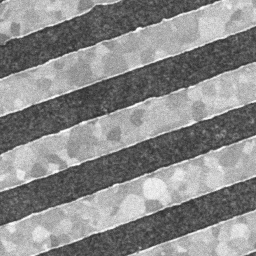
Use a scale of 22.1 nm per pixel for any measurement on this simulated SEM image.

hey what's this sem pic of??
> one or a few lines or trenches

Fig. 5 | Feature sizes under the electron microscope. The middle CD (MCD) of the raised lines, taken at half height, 820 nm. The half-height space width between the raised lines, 736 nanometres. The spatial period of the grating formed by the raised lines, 1550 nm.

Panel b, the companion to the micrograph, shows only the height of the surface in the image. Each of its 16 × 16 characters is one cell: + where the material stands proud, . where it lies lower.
++++++.......+++
+++.......++++++
+......+++++++..
....+++++++.....
.+++++++......++
+++++.......++++
++.......++++++.
......+++++++...
...+++++++......
+++++++......+++
++++......++++++
+......++++++++.
.....+++++++....
..+++++++......+
++++++......++++
+++......+++++++